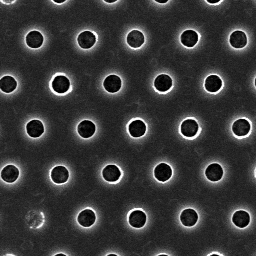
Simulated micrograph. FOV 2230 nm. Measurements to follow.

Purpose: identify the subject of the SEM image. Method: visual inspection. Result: a regular array of holes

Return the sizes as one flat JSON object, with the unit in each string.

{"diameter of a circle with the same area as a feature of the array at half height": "158 nanometres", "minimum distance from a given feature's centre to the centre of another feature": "0.442 micrometres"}